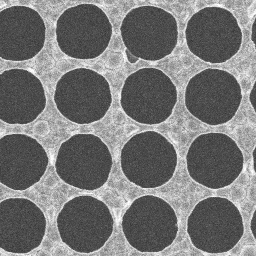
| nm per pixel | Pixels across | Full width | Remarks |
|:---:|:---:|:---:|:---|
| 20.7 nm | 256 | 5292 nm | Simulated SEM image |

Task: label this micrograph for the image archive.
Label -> a regular array of holes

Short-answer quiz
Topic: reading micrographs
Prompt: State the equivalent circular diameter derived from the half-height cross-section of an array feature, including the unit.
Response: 1.17 um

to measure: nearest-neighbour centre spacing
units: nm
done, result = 1300